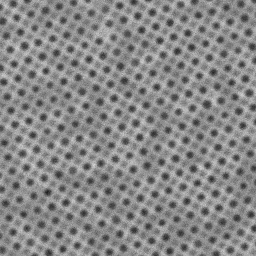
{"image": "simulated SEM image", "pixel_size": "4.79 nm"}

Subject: a regular array of holes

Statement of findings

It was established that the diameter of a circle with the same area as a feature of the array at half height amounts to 46.5 nanometers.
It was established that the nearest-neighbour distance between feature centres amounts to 14.5 px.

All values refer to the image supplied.